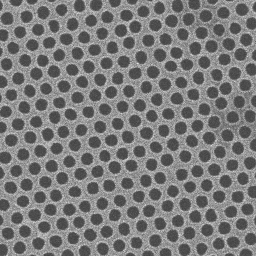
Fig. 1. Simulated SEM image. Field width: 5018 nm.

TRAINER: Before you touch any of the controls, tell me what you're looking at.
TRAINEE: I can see a regular array of holes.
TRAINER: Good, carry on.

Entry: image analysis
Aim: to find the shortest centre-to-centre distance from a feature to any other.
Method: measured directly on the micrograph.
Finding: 320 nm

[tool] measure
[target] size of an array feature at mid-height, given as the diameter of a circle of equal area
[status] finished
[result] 247 nm